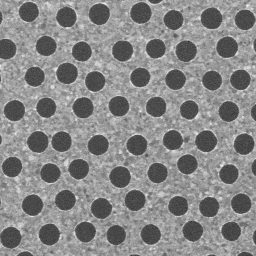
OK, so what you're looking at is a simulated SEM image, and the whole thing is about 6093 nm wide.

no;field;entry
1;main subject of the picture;a regular array of holes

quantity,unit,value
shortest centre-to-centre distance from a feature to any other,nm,734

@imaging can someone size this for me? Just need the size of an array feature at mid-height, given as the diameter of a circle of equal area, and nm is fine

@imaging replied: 507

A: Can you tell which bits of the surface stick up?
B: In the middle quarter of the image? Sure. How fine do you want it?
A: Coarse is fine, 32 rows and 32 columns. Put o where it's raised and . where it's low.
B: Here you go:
...ooooooooooooooooooooooooooooo
...oooooooooooooo....oooooo..ooo
....oo....ooooooo.....oooo....oo
...oo.....oooooo......ooo......o
...oo.....ooooooo....oooo.....oo
ooooo.....ooooooo....ooooo....oo
oooooo...oooooooooooooooooo..ooo
oooooooooooooooooooooooooooooooo
oooo..oooooo...ooooooo...ooooooo
oo.....oooo.....ooooo.....oooo..
oo.....oooo......ooo......ooo...
oo.....oooo.....oooo......ooo...
ooo....ooooo....ooooo....oooo...
oooo..oooooooooooooooooooooooo..
oooooooooooooooooooooooooooooooo
oooooooooooooooooooooooooooooooo
ooooooooooooooooooooooooooo.oooo
.ooooooo.oooooooooooooooo....ooo
..ooooo....ooooo....ooooo.....oo
..oooo.....ooooo.....oooo.....oo
..oooo.....oooo......oooo....ooo
.ooooo.....ooooo.....ooooo..oooo
ooooooo...ooooooo...oooooooooooo
ooooooooooooooooooooooooooooo...
oo....oooooooooooooooooooooo....
o.....oooooooo.oooooo....ooo....
o.....oooooo....ooooo.....ooo...
o.....ooooo......oooo.....oooo..
oo...oooooo......oooo.....oooooo
oooooooooooo.....ooooo...ooooooo
oooooooooooo....oooooooooooooooo
.oooooooooooooooo..ooooooooooooo